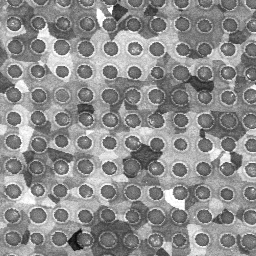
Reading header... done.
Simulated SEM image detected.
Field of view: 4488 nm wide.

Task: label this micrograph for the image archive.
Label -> a regular array of holes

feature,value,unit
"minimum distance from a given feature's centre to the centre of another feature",0.401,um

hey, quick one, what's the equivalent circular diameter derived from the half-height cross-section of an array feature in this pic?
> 266 nanometers